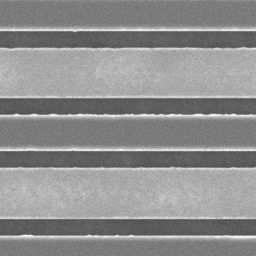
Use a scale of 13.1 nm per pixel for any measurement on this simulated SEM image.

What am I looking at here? lines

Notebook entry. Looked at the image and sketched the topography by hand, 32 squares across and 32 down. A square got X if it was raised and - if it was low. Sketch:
XXXXXXXXXXXXXXXXXXXXXXXXXXXXXXXX
XXXXXXXXXXXXXXXXXXXXXXXXXXXXXXXX
XXXXXXXXXXXXXXXXXXXXXXXXXXXXXXXX
XXXXXXXXXXXXXXXXXXXXXXXXXXXXXXXX
--------------------------------
--------------------------------
XXXXXXXXXXXXXXXXXXXXXXXXXXXXXXXX
XXXXXXXXXXXXXXXXXXXXXXXXXXXXXXXX
XXXXXXXXXXXXXXXXXXXXXXXXXXXXXXXX
XXXXXXXXXXXXXXXXXXXXXXXXXXXXXXXX
XXXXXXXXXXXXXXXXXXXXXXXXXXXXXXXX
XXXXXXXXXXXXXXXXXXXXXXXXXXXXXXXX
--------------------------------
--------------------------------
XXXXXXXXXXXXXXXXXXXXXXXXXXXXXXXX
XXXXXXXXXXXXXXXXXXXXXXXXXXXXXXXX
XXXXXXXXXXXXXXXXXXXXXXXXXXXXXXXX
XXXXXXXXXXXXXXXXXXXXXXXXXXXXXXXX
XXXXXXXXXXXXXXXXXXXXXXXXXXXXXXXX
--------------------------------
--------------------------------
XXXXXXXXXXXXXXXXXXXXXXXXXXXXXXXX
XXXXXXXXXXXXXXXXXXXXXXXXXXXXXXXX
XXXXXXXXXXXXXXXXXXXXXXXXXXXXXXXX
XXXXXXXXXXXXXXXXXXXXXXXXXXXXXXXX
XXXXXXXXXXXXXXXXXXXXXXXXXXXXXXXX
XXXXXXXXXXXXXXXXXXXXXXXXXXXXXXXX
--------------------------------
--------------------------------
--XX-------XX-X-X---------------
XXXXXXXXXXXXXXXXXXXXXXXXXXXXXXXX
XXXXXXXXXXXXXXXXXXXXXXXXXXXXXXXX